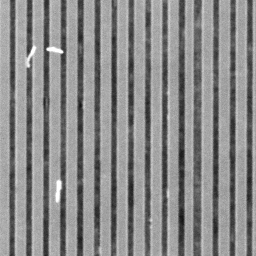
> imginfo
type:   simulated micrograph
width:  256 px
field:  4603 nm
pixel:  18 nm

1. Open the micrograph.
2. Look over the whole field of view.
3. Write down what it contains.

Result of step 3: parallel lines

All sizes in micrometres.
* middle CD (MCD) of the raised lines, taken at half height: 0.175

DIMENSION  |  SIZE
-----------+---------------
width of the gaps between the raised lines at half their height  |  128 nm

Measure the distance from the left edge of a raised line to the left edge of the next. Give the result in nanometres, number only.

304